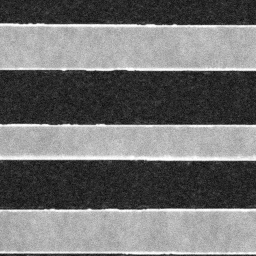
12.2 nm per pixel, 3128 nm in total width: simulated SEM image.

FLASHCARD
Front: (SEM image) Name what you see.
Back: lines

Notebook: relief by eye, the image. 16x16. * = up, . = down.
................
................
****************
****************
................
................
................
................
****************
****************
................
................
................
****************
****************
****************